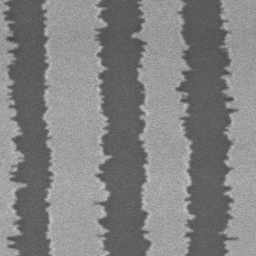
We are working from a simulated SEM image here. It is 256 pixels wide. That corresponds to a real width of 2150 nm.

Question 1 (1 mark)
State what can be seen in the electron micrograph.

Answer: one or a few lines or trenches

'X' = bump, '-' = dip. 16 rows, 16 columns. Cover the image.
---XXX---XX---XX
---XXX---XX---XX
X--XXX---XX---XX
X--XXX---XX---XX
---XXX---XXX--XX
X--XXX---XX---XX
X--XXX---XX---XX
X--XXX---XX---XX
X--XXX---XXX--XX
X--XXX---XXX--XX
X--XXX---XXX--XX
X--XXX---XXX--XX
X--XXX---XXX--XX
X--XXX---XXX--XX
X--XXX---XXX--XX
X--XXX---XXX--XX